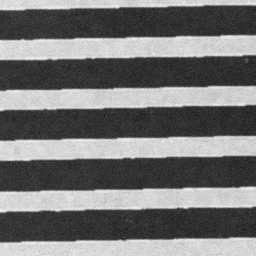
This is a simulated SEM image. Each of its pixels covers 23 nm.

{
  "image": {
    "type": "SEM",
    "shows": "lines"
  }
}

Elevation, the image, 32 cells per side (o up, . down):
oooooooooooooooooooooooooooooooo
................................
................................
................................
................................
oooooooooooooooooooooooooooooooo
oooooooooooooooooooooooooooooooo
................................
................................
................................
................................
oooooooooooooooooooooooooooooooo
oooooooooooooooooooooooooooooooo
ooooooooooooo...................
................................
................................
................................
........oooooooooooooooooooooooo
oooooooooooooooooooooooooooooooo
ooooooooooooooooooooo...........
................................
................................
................................
..............................oo
oooooooooooooooooooooooooooooooo
oooooooooooooooooooooooooooooooo
................................
................................
................................
................................
oooooooooooooooooooooooooooooooo
oooooooooooooooooooooooooooooooo